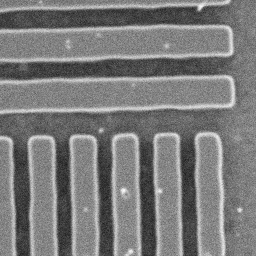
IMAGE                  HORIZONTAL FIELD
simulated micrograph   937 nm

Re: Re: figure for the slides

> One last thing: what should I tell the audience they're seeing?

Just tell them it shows groups of lines, slits or small figures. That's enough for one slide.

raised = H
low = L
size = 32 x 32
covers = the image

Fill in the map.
HHHHHHHHHHHHHHHHHHHHHHHHHHHHLLLL
LLLLLLLLLLLLLLLLLLLLLLLLLLLLLLLL
LLLLLLLLLLLLLLLLLLLLLLLLLLLLLLLL
LLLLLLLLLLLLHHHHHHHHHHHHHHHHHLLL
HHHHHHHHHHHHHHHHHHHHHHHHHHHHHLLL
HHHHHHHHHHHHHHHHHHHHHHHHHHHHHLLL
HHHHHHHHHHHHHHHHHHHHHHHHHHHHHLLL
HHHHHHHHHHHLLLLLLLLLLLLLLLLLLLLL
LLLLLLLLLLLLLLLLLLLLLLLLLLLLLLLL
LLLLLLLLLLLLLLLLLLLLLLLLLLLHHLLL
HHHHHHHHHHHHHHHHHHHHHHHHHHHHHLLL
HHHHHHHHHHHHHHHHHHHHHHHHHHHHHLLL
HHHHHHHHHHHHHHHHHHHHHHHHHHHHHLLL
HHHHHHHHHHHHHHHHHHHHLLHHLLLLLLLL
LLLLLLLLLLLLLLLLLLLLLLLLLLLLLLLL
LLLLLLLLLLLLLLLLLLLLLLLLLLLLLLLL
LLLLLLLLLLLLLLLLLLLLLLLLLLLLLLLL
HLLLHHHLLHHHLLHHHLLHHHLLLHHHLLLL
HLLLHHHLLHHHLLHHHLLHHHLLLHHHLLLL
HHLLHHHLLHHHLLHHHLLHHHLLLHHHLLLL
HHLLHHHLLHHHLLHHHLLHHHLLLHHHLLLL
HHLLHHHLLHHHLLHHHLLHHHHLLHHHLLLL
HHLLHHHLLHHHLLHHHLLHHHHLLHHHLLLL
HHLLHHHLLHHHLLHHHLLHHHHLLHHHLLLL
HHLLHHHLLHHHLLHHHLLHHHHLLHHHLLLL
HHLLHHHLLHHHLLHHHLLLHHHLLHHHLLLL
HHLLHHHLLHHHLLHHHLLLHHHLLHHHLLLL
HHLLHHHLLHHHLLHHHLLLHHHLLHHHLLLL
HHLLHHHLLHHHLLHHHLLLHHHLLHHHLLLL
HHLLHHHLLHHHLLHHHLLLHHHLLHHHLLLL
HHLLHHHLLHHHLLHHHHLLHHHLLHHHLLLL
HHLLHHHLLHHHLLHHHHLLHHHLLHHHLLLL